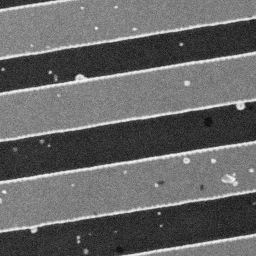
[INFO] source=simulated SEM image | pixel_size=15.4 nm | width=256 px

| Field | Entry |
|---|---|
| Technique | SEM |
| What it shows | lines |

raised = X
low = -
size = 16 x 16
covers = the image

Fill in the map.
-XXXXXXXXXXXXXXX
XXXXXXXXXXXXXX--
XXXXXXXX--------
X--------------X
--------XXXXXXXX
--XXXXXXXXXXXXXX
XXXXXXXXXXXXXX--
XXXXXXXX--------
XX--------------
------------XXXX
------XXXXXXXXXX
XXXXXXXXXXXXXXXX
XXXXXXXXXXXXX---
XXXXXX----------
----------------
-----------XXXXX